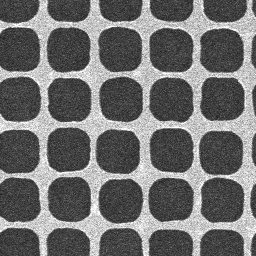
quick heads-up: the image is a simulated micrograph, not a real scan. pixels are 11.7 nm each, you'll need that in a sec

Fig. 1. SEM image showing a regular array of holes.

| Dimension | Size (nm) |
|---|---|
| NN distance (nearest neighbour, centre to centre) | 578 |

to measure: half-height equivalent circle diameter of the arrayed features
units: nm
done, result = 548